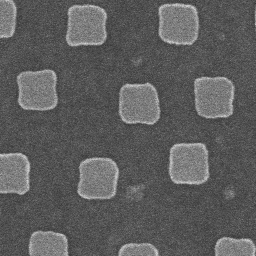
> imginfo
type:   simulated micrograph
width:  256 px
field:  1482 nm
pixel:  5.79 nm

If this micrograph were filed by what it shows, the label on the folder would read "raised bodies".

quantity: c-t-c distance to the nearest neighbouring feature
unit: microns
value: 0.468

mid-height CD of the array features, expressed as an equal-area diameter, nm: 247